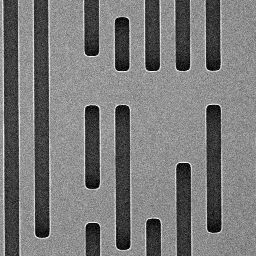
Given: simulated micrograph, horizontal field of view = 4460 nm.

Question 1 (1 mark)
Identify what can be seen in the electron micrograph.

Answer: groups of lines, slits or small figures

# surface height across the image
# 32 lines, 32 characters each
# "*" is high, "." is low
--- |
..**..****..******..**..**..****
..**..****..******..**..**..****
..**..****..**..**..**..**..****
..**..****..**..**..**..**..****
..**..****..**..**..**..**..****
..**..****..**..**..**..**..****
..**..*****.**..**..**..**..****
..**..********..**..**..**..****
..**..********..**..**..**.*****
..**..**************************
..**..**************************
..**..**************************
..**..**************************
..**..*****.**..**********.*****
..**..****..**..**********..****
..**..****..**..**********..****
..**..*****.**..**********..****
..**..*****..*..**********..****
..**..*****..*..**********..****
..**..*****..*..**********..****
..**..*****..*..******.***..****
..**..*****..*..******..**..****
..**..*****..*..******..**..****
..**..*****.**..******..**..****
..**..********..******..**..****
..**..********..******..**..****
..**..********..******..**..****
..**..********..***.**..**..****
..**..*****.**..**..**..**..****
..***.*****..*..**..**..********
..*********..*..**..**..********
..*********..*****..**..********